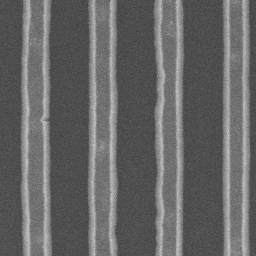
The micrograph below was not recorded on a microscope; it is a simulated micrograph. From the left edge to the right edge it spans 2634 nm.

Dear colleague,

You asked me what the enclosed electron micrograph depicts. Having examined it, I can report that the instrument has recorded one or a few lines or trenches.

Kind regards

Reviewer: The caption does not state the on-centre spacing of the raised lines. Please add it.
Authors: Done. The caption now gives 66.8 px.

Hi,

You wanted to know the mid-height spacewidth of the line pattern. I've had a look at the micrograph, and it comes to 460 nm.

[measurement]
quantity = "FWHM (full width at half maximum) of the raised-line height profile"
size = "226 nanometres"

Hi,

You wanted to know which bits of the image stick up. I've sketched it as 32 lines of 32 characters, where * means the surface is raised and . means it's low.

...***.....***......**......***.
...***.....***......***.....***.
...***.....***......***.....***.
...***.....***......***.....***.
...***......**......***.....***.
...***......**......***.....***.
...***......**......***.....***.
...***......**......***.....***.
...***......**......***.....***.
...***.....***......**......***.
...***.....***......**......***.
...***......**......**......***.
...***......**......**......***.
...***.....***......**......***.
...***.....***......**......***.
...***.....***......***.....***.
...***.....***......***.....***.
...***.....***......***.....***.
...***.....***......***.....***.
...***.....***......***.....***.
...***.....***......***.....***.
...***.....***......***.....***.
...***.....***......***.....***.
...***.....***......**......***.
...***.....***......**......***.
...***.....***......***.....***.
...***.....***......***.....***.
...***.....***......***.....***.
...***.....***......**......***.
...***.....***......**......***.
...***.....***......**......***.
...***.....***......**......***.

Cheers